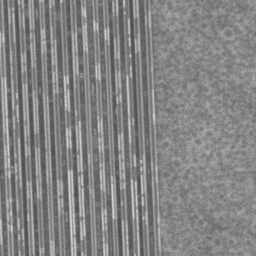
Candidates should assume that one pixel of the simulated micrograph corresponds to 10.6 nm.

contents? parallel lines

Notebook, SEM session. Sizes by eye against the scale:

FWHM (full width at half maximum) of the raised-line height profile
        51.5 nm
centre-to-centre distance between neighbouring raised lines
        111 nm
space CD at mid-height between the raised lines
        63.3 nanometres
